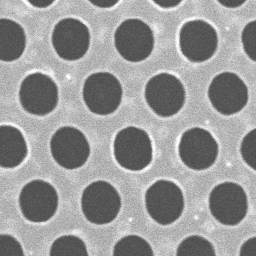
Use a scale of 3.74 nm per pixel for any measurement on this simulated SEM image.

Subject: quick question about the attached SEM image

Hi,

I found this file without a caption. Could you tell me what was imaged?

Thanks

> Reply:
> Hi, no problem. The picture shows a regular array of holes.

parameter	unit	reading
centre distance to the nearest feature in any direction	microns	0.232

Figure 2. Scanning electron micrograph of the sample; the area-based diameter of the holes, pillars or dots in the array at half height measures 155 nanometres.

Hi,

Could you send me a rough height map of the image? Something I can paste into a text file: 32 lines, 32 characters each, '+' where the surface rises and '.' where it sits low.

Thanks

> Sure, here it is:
++++..+++++...++++++..++++++..++
++++++++++++++++++++++++++++++++
.+++++++..++++++..++++++++++++++
...++++....++++....++++....++++.
...+++.....+++.....+++.....+++..
...++++....+++.....+++.....+++..
...++++....++++....++++....++++.
..++++++.+++++++..++++++..++++++
++++++++++++++++++++++++++++++++
+++...+++++...+++++...+++++...++
+++....+++.....+++.....+++.....+
++.....+++.....+++.....+++.....+
++.....+++.....+++.....+++.....+
+++....++++....++++....++++...++
++++++++++++++++++++.+++++++++++
++++++++++++++++++++++++++++++++
...++++...+++++...+++++...+++++.
...+++.....+++.....+++.....+++..
...+++.....+++.....+++.....+++..
...++++....+++.....+++.....+++..
..+++++...+++++....++++....++++.
++++++++++++++++++++++++++++++++
++++.+++++++++++++++++++++++++++
+++....++++...+++++...+++++...++
+++....+++.....+++.....+++.....+
++.....+++.....+++.....+++.....+
+++....+++.....+++.....+++.....+
++++..+++++...+++++...+++++...++
++++++++++++++++++++++++++++++++
.+++++++.+++++++.+++++++.+++++++
..+++++....++++....++++...++++..
...+++.....+++.....+++.....+++..